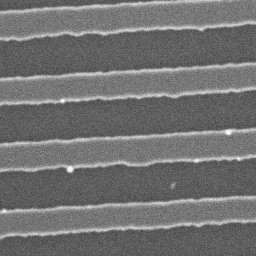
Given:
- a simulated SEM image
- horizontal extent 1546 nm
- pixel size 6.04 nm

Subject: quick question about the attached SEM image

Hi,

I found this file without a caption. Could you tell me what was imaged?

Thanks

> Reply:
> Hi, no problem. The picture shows lines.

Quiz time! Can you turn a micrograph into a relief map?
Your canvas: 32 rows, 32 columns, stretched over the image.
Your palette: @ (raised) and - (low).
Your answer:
---------------@@@@@@@@@@@@@@@@@
@@@@@@@@@@@@@@@@@@@@@@@@@@@@@@@@
@@@@@@@@@@@@@@@@@@@@@@@@@@@@@@@@
@@@@@@@@@@@@@@@@@@@@@@@@@@------
@@@@@@--------------------------
--------------------------------
--------------------------------
--------------------------------
----------------------@@@@@@@@@@
-------@@@@@@@@@@@@@@@@@@@@@@@@@
@@@@@@@@@@@@@@@@@@@@@@@@@@@@@@@@
@@@@@@@@@@@@@@@@@@@@@@@@@@@@----
@@@@@@@@@@@---------------------
--------------------------------
--------------------------------
--------------------------------
-------------------------@@@@@@@
-------@-@@@@@@@@@@@@@@@@@@@@@@@
@@@@@@@@@@@@@@@@@@@@@@@@@@@@@@@@
@@@@@@@@@@@@@@@@@@@@@@@@@@@@@@@@
@@@@@@@@@@@@@@@-@@@-------------
--------------------------------
--------------------------------
--------------------------------
--------------------------------
----------------@@@@@@@@@@@@@@@@
@@@@@@@@@@@@@@@@@@@@@@@@@@@@@@@@
@@@@@@@@@@@@@@@@@@@@@@@@@@@@@@@@
@@@@@@@@@@@@@@@@@@@@@-----------
@-------------------------------
--------------------------------
--------------------------------